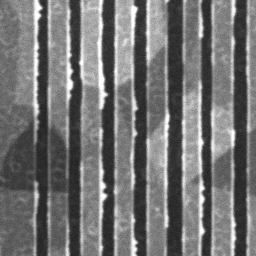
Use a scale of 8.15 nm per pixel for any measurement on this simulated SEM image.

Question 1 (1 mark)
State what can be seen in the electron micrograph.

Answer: parallel lines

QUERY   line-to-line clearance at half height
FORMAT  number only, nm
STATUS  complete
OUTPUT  103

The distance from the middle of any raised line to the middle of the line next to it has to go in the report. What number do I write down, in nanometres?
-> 268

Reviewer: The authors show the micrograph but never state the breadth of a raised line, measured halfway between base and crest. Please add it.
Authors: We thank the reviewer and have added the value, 159 nanometres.